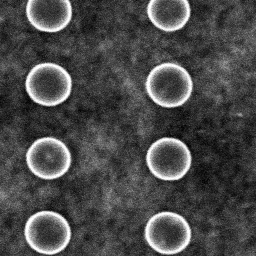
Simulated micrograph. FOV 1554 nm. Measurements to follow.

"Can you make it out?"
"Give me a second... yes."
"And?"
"raised bodies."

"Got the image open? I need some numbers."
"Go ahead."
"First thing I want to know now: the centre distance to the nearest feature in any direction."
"449 nanometres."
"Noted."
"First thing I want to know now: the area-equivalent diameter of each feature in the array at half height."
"253 nanometres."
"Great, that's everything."